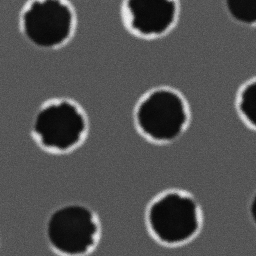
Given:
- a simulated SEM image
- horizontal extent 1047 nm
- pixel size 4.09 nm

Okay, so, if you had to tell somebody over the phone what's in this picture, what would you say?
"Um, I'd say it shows holes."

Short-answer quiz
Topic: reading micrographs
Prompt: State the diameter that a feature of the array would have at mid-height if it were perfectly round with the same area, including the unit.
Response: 196 nanometres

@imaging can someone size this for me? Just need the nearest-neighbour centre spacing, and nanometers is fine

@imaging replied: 421